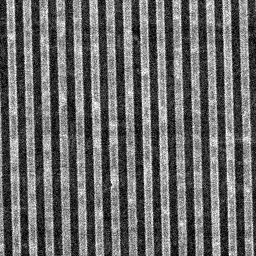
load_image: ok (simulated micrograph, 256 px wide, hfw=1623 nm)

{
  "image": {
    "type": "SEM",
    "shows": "parallel lines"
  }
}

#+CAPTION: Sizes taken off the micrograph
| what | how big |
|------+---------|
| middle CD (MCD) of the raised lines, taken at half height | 40.4 nm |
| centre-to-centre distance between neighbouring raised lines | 105 nm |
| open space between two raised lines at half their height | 10 pixels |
